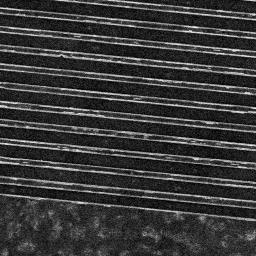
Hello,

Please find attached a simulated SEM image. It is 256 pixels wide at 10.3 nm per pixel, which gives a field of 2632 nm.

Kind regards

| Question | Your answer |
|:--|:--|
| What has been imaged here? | parallel lines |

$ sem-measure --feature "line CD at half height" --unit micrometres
0.0614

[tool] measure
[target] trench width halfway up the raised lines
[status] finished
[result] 130 nm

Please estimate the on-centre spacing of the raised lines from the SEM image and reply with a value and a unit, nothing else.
0.192 µm